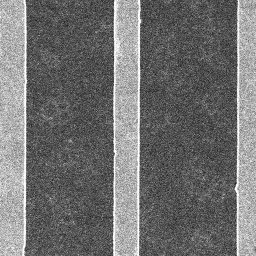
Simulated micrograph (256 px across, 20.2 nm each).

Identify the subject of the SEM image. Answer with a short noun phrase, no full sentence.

one or a few lines or trenches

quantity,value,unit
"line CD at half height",25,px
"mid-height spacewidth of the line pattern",1.89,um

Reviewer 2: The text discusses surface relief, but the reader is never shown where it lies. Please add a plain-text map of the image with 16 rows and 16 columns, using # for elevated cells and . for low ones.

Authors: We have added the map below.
##.....##......#
##.....##......#
##.....##......#
##.....##......#
##.....##......#
##.....##......#
##.....##......#
##.....##......#
##.....##......#
##.....##......#
##.....##......#
##.....##......#
##.....##......#
##.....##......#
##.....##......#
##.....##......#